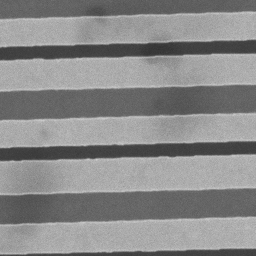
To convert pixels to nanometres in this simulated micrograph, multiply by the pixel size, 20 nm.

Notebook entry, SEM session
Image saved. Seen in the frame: lines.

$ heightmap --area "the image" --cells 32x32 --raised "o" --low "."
................................
................................
oooooooooooooooooooooooooooooooo
oooooooooooooooooooooooooooooooo
oooooooooooooooooooooooooooooooo
oooooooooo......................
................................
....oooooooooooooooooooooooooooo
oooooooooooooooooooooooooooooooo
oooooooooooooooooooooooooooooooo
oooooooooooooooooooooooooooooooo
................................
................................
................................
....................oooooooooooo
oooooooooooooooooooooooooooooooo
oooooooooooooooooooooooooooooooo
oooooooooooooooooooooooooooooooo
................................
.............................ooo
oooooooooooooooooooooooooooooooo
oooooooooooooooooooooooooooooooo
oooooooooooooooooooooooooooooooo
ooooooooooooooooooooooooooooo...
................................
................................
................................
......................oooooooooo
oooooooooooooooooooooooooooooooo
oooooooooooooooooooooooooooooooo
oooooooooooooooooooooooooooooooo
ooooooooo.......................